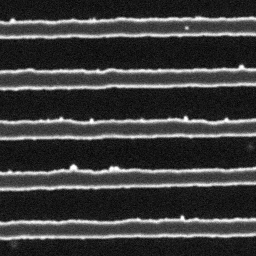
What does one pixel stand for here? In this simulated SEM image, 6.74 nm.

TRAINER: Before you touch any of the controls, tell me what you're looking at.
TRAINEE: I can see lines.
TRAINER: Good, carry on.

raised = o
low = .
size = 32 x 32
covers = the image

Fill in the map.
................................
................................
..............oooooooooooooooooo
oooooooooooooooooooooooooooooooo
ooooooooooooooooooooooo.........
................................
................................
................................
..............................o.
oooooooooooooooooooooooooooooooo
oooooooooooooooooooooooooooooooo
................................
................................
................................
................................
oooooooooooooooooooooooooooooooo
oooooooooooooooooooooooooooooooo
................................
................................
................................
................................
......oooooooooooooooooooooooooo
oooooooooooooooooooooooooooooooo
ooooooooo.ooo...................
................................
................................
................................
................ooo.oooooooooooo
oooooooooooooooooooooooooooooooo
ooooooooooooooooooooooooo.ooo...
................................
................................